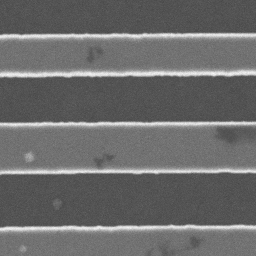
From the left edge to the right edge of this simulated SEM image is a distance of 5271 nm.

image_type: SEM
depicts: lines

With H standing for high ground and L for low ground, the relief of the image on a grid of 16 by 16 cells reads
LLLLLLLLLLLLLLLL
LLLLLLLLLLLLLLLL
HHHHHHHHHHHHHHHH
HHHHHHHHHHHHHHHH
HHHHHHHHHHHHHHHH
LLLLLLLLLLLLLLLL
LLLLLLLLLLLLLLLL
LLLLLLLLLLLLLLLL
HHHHHHHHHHHHHHHH
HHHHHHHHHHHHHHHH
HHHHHHHHHHHHHHHH
LLLLLLLLLLLLLLLL
LLLLLLLLLLLLLLLL
LLLLLLLLLLLLLLLL
HHHHHHHHHHHHHHHH
HHHHHHHHHHHHHHHH